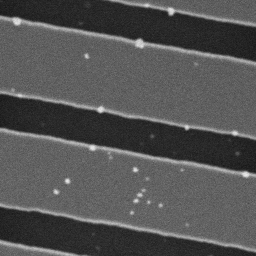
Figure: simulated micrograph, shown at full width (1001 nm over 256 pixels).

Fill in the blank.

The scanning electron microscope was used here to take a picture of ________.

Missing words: lines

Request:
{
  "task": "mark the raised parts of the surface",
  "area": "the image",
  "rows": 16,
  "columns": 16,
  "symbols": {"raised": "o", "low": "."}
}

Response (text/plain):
.........ooooooo
ooo............o
ooooooooo.......
oooooooooooooo..
oooooooooooooooo
oooooooooooooooo
....oooooooooooo
.........ooooooo
ooo............o
oooooooo........
oooooooooooooo..
oooooooooooooooo
oooooooooooooooo
....oooooooooooo
.........ooooooo
oo.............o